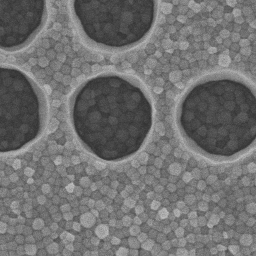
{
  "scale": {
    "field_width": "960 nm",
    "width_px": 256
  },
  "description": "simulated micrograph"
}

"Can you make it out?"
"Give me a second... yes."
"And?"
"holes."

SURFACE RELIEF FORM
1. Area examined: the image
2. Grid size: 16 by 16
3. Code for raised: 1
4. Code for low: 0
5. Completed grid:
0001100000111111
0001100000111111
0011110001111111
1111111111111111
0111111111111111
0011100001110000
0001000001100000
0001000001100000
0011100001100000
1111110011110001
1111111111111111
1111111111111111
1111111111111111
1111111111111111
1111111111111111
1111111111111111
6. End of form